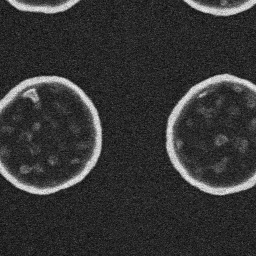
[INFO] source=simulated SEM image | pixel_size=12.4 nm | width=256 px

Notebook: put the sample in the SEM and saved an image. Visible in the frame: raised bodies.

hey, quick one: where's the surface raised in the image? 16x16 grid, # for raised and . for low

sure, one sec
..##........###.
................
................
................
................
.####.......####
######.....#####
######.....#####
######.....#####
######.....#####
#####......#####
.###........####
................
................
................
................